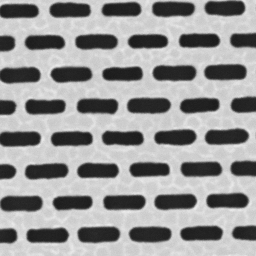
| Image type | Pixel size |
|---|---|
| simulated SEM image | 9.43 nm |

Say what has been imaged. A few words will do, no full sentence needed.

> a regular array of holes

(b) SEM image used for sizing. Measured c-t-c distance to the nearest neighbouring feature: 0.386 micrometres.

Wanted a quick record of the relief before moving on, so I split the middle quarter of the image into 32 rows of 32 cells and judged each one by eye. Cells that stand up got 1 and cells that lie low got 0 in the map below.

11111111111111111111111000000000
00000001110000000000110000000000
00000001100000000000110000000000
00000001110000000001110000000000
00000111111111111111111111111111
11111111111111111111111111111111
11111111111111111111111111111111
11111111111111111111111111111111
11111111111111111000000001111111
11100000000000110000000000011000
11100000000000110000000000011000
11100000000001110000000000111000
11111111110011111110111111111111
11111111111111111111111111111111
11111111111111111111111111111111
11111111111111111111111111111111
11111111111111111111111100000000
00000001110000000000111000000000
00000001100000000000110000000000
00000001110000000000111000000000
00001111111111111111111111110111
11111111111111111111111111111111
11111111111111111111111111111111
11111111111111111111111111111111
11111011111111111100001111111110
01110000000000110000000000111000
01100000000000110000000000011000
01100000000000111000000000111100
11111000000011111111111111111111
11111111111111111111111111111111
11111111111111111111111111111111
11111111111111111111111111111111